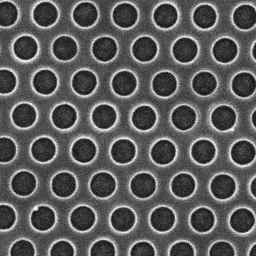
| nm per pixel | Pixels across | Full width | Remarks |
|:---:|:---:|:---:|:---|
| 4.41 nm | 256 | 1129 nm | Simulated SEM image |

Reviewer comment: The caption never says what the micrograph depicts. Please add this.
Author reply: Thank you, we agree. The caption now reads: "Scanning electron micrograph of a regular array of holes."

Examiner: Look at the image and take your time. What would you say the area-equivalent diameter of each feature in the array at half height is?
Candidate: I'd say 114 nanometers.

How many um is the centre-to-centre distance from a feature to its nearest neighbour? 0.172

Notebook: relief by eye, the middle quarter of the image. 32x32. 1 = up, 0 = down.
11111111111111111111111111111111
11110011111111101111111111111111
11100000111110000111111000011111
11000000111100000011110000001111
11000000011100000011110000001111
11000000111100000011110000001111
11000000111100000011110000001111
11100001111110000111111000011111
11111111111111111111111111111111
11111111111111111111111111111111
00111111000011111110001111111001
00011110000001111100000111100000
00011110000001111000000111100000
00011110000001111000000111100000
00011110000001111000000111100000
00111111000011111000001111110000
11111111111111111110011111111001
11111111111111111111111111111111
11110011111111111111111111111111
11100001111110000111111000011111
11000000111100000011110000001111
11000000111100000011110000001111
11000000111100000011110000001111
11000000111100000011110000001111
11110011111110000111111000011111
11111111111111111111111111111111
11111111111111111111111111111111
00111111000011111100001111111000
00011110000001111000000111100000
00011110000001111000000111100000
00011100000001110000000111100000
00011110000001111000000111100000